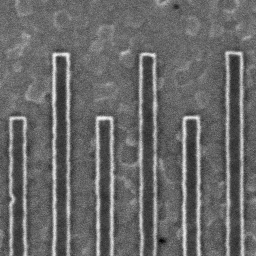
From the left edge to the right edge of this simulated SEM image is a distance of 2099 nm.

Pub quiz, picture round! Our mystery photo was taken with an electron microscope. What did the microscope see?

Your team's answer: parallel lines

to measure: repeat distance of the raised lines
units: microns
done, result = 0.356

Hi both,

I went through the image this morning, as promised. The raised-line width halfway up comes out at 116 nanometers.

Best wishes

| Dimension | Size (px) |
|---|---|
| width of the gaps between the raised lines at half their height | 29.1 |